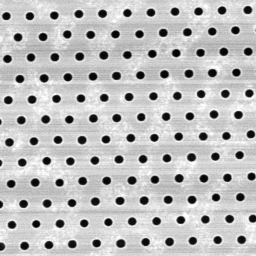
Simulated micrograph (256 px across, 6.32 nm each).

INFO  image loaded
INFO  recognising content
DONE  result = a regular array of holes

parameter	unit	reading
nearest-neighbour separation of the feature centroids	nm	148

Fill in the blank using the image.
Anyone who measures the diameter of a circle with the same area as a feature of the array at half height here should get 0.0519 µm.